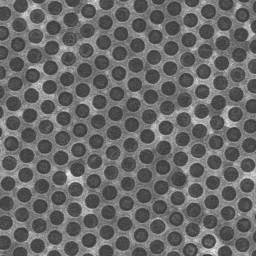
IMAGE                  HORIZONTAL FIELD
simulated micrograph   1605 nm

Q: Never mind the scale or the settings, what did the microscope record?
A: a regular array of holes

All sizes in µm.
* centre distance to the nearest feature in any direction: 0.121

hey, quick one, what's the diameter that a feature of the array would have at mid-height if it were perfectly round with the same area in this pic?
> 0.0952 um